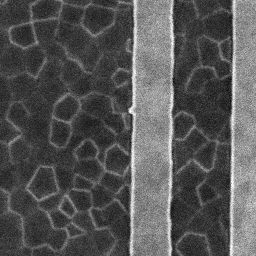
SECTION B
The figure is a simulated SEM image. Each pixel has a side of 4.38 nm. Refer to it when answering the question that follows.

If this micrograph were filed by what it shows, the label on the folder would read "one or a few lines or trenches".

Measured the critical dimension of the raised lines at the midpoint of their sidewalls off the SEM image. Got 169 nanometers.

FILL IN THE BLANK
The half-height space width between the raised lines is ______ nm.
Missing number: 269